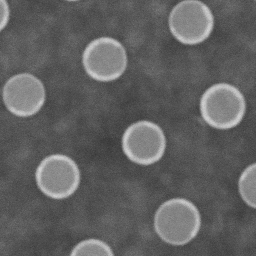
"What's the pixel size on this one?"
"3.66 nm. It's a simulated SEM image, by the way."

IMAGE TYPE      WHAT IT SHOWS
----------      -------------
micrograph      raised bodies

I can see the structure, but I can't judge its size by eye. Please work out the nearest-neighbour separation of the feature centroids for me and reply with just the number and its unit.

324 nm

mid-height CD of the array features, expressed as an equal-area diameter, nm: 157